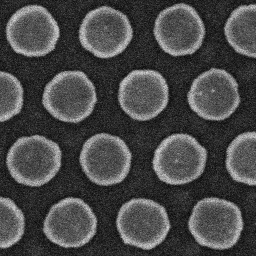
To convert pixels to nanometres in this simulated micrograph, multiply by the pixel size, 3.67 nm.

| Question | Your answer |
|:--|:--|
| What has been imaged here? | a regular array of raised bodies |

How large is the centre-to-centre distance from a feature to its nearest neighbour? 0.266 µm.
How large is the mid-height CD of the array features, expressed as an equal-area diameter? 48.3 pixels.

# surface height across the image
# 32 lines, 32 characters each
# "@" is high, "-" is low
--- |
--------------------------------
---@@@-----@@@@-----@@@@-----@@@
-@@@@@@----@@@@@----@@@@@----@@@
-@@@@@@---@@@@@@----@@@@@---@@@@
-@@@@@@---@@@@@@----@@@@@---@@@@
-@@@@@@----@@@@@----@@@@@----@@@
--@@@@------@@@------@@@------@@
--------------------------------
--------------------------------
@------@@@------@@@@-----@@@@---
@@----@@@@@----@@@@@@---@@@@@---
@@@---@@@@@@---@@@@@@---@@@@@@--
@@@---@@@@@@---@@@@@@---@@@@@@--
@@----@@@@@----@@@@@----@@@@@---
@------@@@@------@@------@@@----
--------------------------------
--------------------------------
---@@@-----@@@@------@@@------@@
--@@@@@----@@@@@----@@@@@----@@@
-@@@@@@---@@@@@@----@@@@@@---@@@
-@@@@@@---@@@@@@---@@@@@@---@@@@
--@@@@@----@@@@@----@@@@@----@@@
---@@@------@@@------@@@------@@
--------------------------------
--------------------------------
@------@@@@-----@@@------@@@@---
@@----@@@@@----@@@@@----@@@@@@--
@@@---@@@@@@---@@@@@@---@@@@@@--
@@@---@@@@@@---@@@@@@---@@@@@@--
@@@---@@@@@----@@@@@----@@@@@@--
@@-----@@@-------@@-------@@@---
--------------------------------